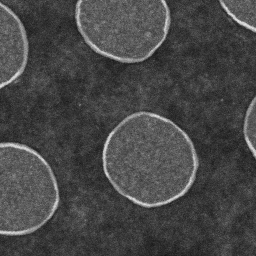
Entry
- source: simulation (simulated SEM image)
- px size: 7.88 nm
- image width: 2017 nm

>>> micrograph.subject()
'raised bodies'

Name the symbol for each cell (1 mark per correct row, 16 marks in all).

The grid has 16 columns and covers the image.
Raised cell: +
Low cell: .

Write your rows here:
.....+++++....++
+....+++++.....+
++...+++++......
++.....++.......
+...............
................
................
........++.....+
.......+++++...+
++....++++++....
+++....+++++....
++++...+++++....
++++....+++.....
+++.............
++..............
................